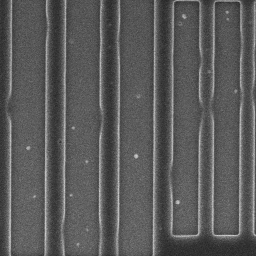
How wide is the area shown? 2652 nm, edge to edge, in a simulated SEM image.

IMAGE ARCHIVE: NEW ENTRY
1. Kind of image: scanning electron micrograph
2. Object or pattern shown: groups of lines, slits or small figures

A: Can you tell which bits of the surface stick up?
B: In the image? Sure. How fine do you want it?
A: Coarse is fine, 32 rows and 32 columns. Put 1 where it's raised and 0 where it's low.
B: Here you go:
10000011000001100001110001100011
10000011000001100001110001100011
10000011000001100001110001100011
10000011000001100001110001100011
10000011000001100001110001100011
10000011000001100001110001100011
10000011000001100001110001100011
10000011000001100001110001100011
10000011000001100001110001100011
10000011000001100001110001100011
10000011000001100001110001100011
10000011000001100001110001100011
10000011000001100001110001000011
10000011000001100001110001000011
10000011000001100001110001100011
10000011000001100001110001100011
10000011000001100001110001100011
10000011000001100001110001100011
10000011000001100001110001100011
10000011000001100001110001100011
10000011000001100001100001100011
10000011000011100001100001100011
10000011000011100001100001100011
10000011000011100001100001100011
10000011000011100001100001100011
10000011000011100001110001100011
10000011000011100001110001100011
10000011000011100001110001100011
10000011000001100001100001100011
10000011000001100001110011111111
10000011000001100001111111111111
10000011000001100001111111111111